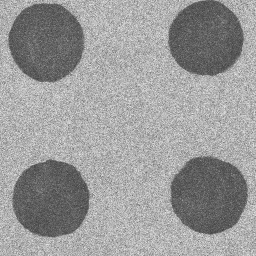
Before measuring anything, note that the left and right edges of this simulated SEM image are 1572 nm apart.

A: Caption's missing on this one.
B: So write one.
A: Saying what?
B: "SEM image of holes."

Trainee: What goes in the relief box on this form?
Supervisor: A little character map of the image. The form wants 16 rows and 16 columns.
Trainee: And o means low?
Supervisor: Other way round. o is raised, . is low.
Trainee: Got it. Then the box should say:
oo..oooooooo..oo
o....oooooo....o
o....oooooo....o
o....oooooo....o
o...oooooooo..oo
oooooooooooooooo
oooooooooooooooo
oooooooooooooooo
oooooooooooooooo
oooooooooooooooo
oo...oooooo....o
o....oooooo....o
o.....ooooo....o
o....oooooo....o
oo..oooooooo..oo
oooooooooooooooo